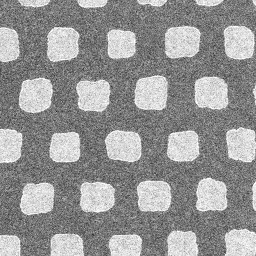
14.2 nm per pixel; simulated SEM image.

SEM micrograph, a regular array of raised bodies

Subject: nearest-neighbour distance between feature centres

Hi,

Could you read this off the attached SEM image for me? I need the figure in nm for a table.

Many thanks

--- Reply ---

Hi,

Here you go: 816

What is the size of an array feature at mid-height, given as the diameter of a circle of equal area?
467 nm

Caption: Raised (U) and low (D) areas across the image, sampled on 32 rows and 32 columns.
DDDUUUDDDDUUUDDDDDDUDDDDDUUDDDDD
DDDDDDDDDDDDDDDDDDDDDDDDDDDDDDDD
DDDDDDDDDDDDDDDDDDDDDDDDDDDDDDDD
DDDDDDDDDDDDDDDDDDDDDDUUDDDDDUUD
UUDDDDUUUUDDDDUUUDDDDUUUUDDDUUUU
UUDDDDUUUUDDDDUUUDDDDUUUUDDDUUUU
UUDDDDUUUUDDDDUUUDDDDUUUUDDDUUUU
UDDDDDDUDDDDDDDDDDDDDDDDDDDDDDDD
DDDDDDDDDDDDDDDDDDDDDDDDDDDDDDDD
DDDDDDDDDDDDDDDDDDDDDDDDDDDDDDDD
DDDUUUDDDDUUUDDDDUUUUDDDUUUUDDDD
DDDUUUDDDDUUUUDDDUUUUDDDUUUUDDDD
DDDUUUDDDDUUUUDDDUUUUDDDDUUUDDDD
DDDUUUDDDDUUUDDDDDUUDDDDDDUUDDDD
DDDDDDDDDDDDDDDDDDDDDDDDDDDDDDDD
DDDDDDDDDDDDDDDDDDDDDDDDDDDDDDDD
UUDDDDDDDDDDDDUUDDDDDDDUDDDDDUUU
UUUDDDDUUUDDDUUUUDDDDUUUUDDDUUUU
UUUDDDUUUUDDDUUUUUDDDUUUUDDDDUUU
UUDDDDUUUUDDDDUUUDDDDUUUUDDDDUUU
DDDDDDDDDDDDDDDDDDDDDDDDDDDDDDDD
DDDDDDDDDDDDDDDDDDDDDDDDDDDDDDDD
DDDDDDDDDDDDDDDDDDDDDDDDDUUDDDDD
DDDUUUUDDDUUUUDDDUUUUDDDDUUUDDDD
DDDUUUUDDDUUUUDDDUUUUDDDDUUUDDDD
DDDUUUUDDDUUUUDDDUUUUDDDDUUUDDDD
DDDUUUDDDDDDDDDDDDDDDDDDDDDDDDDD
DDDDDDDDDDDDDDDDDDDDDDDDDDDDDDDD
DDDDDDDDDDDDDDDDDDDDDDDDDDDDDDDD
DDDDDDDUUUDDDDDUUDDDDUUUDDDDUUUU
UUDDDDUUUUDDDDUUUUDDDUUUUDDDUUUU
UUDDDDUUUUDDDDUUUUDDDUUUUDDDUUUU